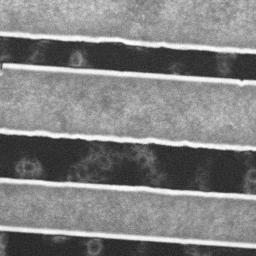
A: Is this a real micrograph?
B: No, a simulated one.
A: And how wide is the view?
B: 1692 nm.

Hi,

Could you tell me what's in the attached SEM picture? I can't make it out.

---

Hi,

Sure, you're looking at one or a few lines or trenches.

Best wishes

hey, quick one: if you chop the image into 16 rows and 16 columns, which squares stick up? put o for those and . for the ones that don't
oooooooooooooooo
oooooooooooooooo
.......ooooooooo
................
oooooo..........
oooooooooooooooo
oooooooooooooooo
oooooooooooooooo
....oooooooooooo
................
................
ooo.............
oooooooooooooooo
oooooooooooooooo
...ooooooooooooo
................